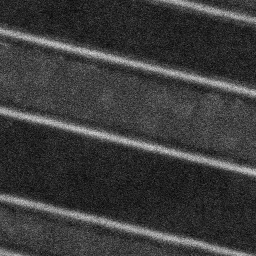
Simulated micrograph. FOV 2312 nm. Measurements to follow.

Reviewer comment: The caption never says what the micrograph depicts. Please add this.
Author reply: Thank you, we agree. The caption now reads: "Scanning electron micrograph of one or a few lines or trenches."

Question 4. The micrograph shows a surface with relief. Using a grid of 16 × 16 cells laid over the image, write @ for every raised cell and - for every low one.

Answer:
@@@@@@@@@@@@@---
@@@@@@@@@@@@@@@@
--@@@@@@@@@@@@@@
-------@@@@@@@@@
-----------@@@@@
---------------@
----------------
@@@-------------
@@@@@@@---------
@@@@@@@@@@@-----
@@@@@@@@@@@@@@@-
@@@@@@@@@@@@@@@@
-@@@@@@@@@@@@@@@
-----@@@@@@@@@@@
---------@@@@@@@
-------------@@@